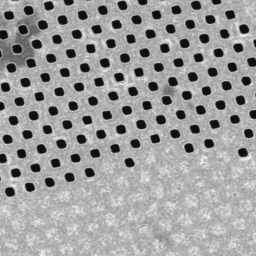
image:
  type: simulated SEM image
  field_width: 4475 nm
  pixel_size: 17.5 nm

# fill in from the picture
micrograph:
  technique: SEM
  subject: a regular array of holes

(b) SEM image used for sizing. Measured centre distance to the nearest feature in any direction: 347 nanometers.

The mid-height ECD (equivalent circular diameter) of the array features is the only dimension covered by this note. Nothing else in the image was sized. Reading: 172 nm